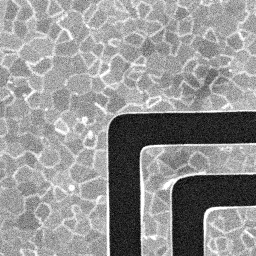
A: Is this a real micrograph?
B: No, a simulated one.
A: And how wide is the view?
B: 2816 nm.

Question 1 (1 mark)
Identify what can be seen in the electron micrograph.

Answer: groups of lines, slits or small figures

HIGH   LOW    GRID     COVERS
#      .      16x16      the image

################
################
################
################
################
################
################
#######.........
#######.........
#######..#######
#######..#######
#######..##.....
#######..##.....
#######..##..###
#######..##..###
#######..##..###